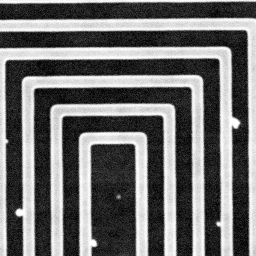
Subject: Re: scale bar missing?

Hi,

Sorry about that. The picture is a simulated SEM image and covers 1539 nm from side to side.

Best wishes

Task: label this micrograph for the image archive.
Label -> groups of lines, slits or small figures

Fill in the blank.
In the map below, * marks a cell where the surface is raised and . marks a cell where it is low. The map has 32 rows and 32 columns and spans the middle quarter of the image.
................................
................................
................................
********************************
********************************
****************...............*
................................
................................
................................
................................
***************************.....
****************************....
****************************....
.........................***....
.........................***....
.........................***....
.........................***....
.....***************.....***....
....*****************....***....
....*****************....***....
....***...........***....***....
....**............***....***....
....**............***....***....
....**............***....***....
....**............***....***....
....**............***....***....
....**............***....***....
....**............***....***....
....**............***....***....
....**............***....***....
....**............***....***....
....**............***....***....